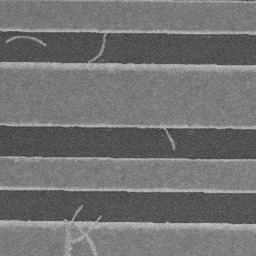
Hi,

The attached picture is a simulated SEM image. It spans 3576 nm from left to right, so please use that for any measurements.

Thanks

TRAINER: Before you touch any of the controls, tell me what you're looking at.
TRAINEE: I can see lines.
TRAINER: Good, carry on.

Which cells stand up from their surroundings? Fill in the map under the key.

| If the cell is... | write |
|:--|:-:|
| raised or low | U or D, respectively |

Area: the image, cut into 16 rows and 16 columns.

UUUUUUUUUUUUUUUU
UUUUUUUUUUUUUUUU
DDDDDDDDDDDDDDDD
DDDDDDDDDDDDDDDD
UUUUUUUUUUUUUUUU
UUUUUUUUUUUUUUUU
UUUUUUUUUUUUUUUU
UUUUUUUUUUUUUUUU
DDDDDDDDDDDDDDDD
DDDDDDDDDDDDDDDD
UUUUUUUUUUUUUUUU
UUUUUUUUUUUUUUUU
DDDDDDDDDDDDDDDD
DDDDDDDDDDDDDDDD
UUUUUUUUUUUUUUUU
UUUUUUUUUUUUUUUU